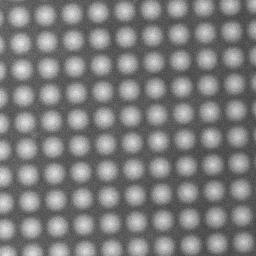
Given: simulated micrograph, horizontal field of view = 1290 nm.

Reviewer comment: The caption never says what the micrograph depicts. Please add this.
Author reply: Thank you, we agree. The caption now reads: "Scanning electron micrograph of an array of small figures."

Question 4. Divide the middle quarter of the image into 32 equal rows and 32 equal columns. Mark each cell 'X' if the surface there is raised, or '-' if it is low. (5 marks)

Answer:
XXXXX--XXXXX--XXXX--XXXXX--XXXX-
XXXXX--XXXX---XXXX---XXX-----X--
-XXX----XXX---------------------
-----------------------------X--
---------------XXX---XXXX---XXXX
-XXXX---XXXX--XXXX---XXXX--XXXXX
-XXXX--XXXXX--XXXXX-XXXXX--XXXXX
-XXXXX-XXXXX--XXXXX--XXXX---XXX-
-XXXX---XXXX---XXX----XX--------
--XX----------------------------
----------------------XX----XXX-
---X-----XX----XXX---XXXX---XXXX
-XXXXX--XXXX--XXXXX--XXXXX-XXXXX
-XXXXX--XXXX--XXXXX--XXXXX--XXXX
-XXXXX--XXXX---XXXX---XXX----XX-
--XXX----XX-----X---------------
--------------------------------
----------------XX----XXX---XXXX
--XXX----XXX---XXXX--XXXXX--XXXX
--XXXX--XXXXX--XXXX--XXXXX--XXXX
-XXXXX--XXXXX--XXXX--XXXXX--XXXX
--XXXX--XXXXX--XXXX---XXX-------
--XXX---------------------------
-----------------------------XXX
----------XX----XXX---XXXX--XXXX
--XXXX---XXXX--XXXXX--XXXX--XXXX
--XXXXX-XXXXX--XXXXX--XXXX--XXXX
--XXXXX--XXXX--XXXXX--XXXX---XXX
--XXXX---XXX----XXX-------------
--------------------------------
-----------------------XXX---XXX
----XX---XXXX---XXXX--XXXXX--XXX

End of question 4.